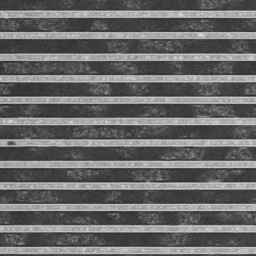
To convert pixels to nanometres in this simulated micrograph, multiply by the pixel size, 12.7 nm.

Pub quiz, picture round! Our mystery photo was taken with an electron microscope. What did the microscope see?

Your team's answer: parallel lines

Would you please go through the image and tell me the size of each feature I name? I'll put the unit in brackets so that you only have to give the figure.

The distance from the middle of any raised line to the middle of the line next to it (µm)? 0.272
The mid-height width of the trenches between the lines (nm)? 182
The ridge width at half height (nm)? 85.6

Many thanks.